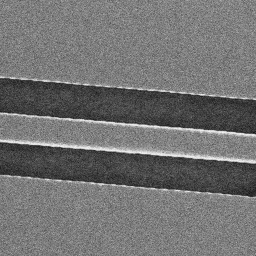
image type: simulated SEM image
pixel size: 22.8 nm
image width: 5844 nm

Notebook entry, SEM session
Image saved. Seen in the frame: lines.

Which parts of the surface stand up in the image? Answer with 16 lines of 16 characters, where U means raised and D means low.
UUUUUUUUUUUUUUUU
UUUUUUUUUUUUUUUU
UUUUUUUUUUUUUUUU
UUUUUUUUUUUUUUUU
UUUUUUUUUUUUUUUU
DDDDDDDDUUUUUUUU
DDDDDDDDDDDDDDDD
UUUUUDDDDDDDDDDD
UUUUUUUUUUUUUUUU
DDDDDDDDUUUUUUUU
DDDDDDDDDDDDDDDD
UUUUUUUDDDDDDDDD
UUUUUUUUUUUUUUUU
UUUUUUUUUUUUUUUU
UUUUUUUUUUUUUUUU
UUUUUUUUUUUUUUUU